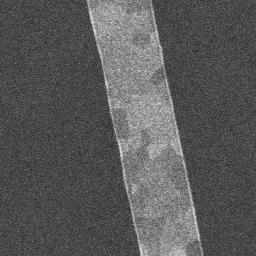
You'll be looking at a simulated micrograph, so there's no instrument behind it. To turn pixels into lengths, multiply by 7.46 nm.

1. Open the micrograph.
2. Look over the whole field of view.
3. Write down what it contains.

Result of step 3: one or a few lines or trenches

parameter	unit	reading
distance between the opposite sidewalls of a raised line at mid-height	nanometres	456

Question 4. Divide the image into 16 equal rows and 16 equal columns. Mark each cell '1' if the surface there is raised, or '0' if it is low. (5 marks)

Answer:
0000001111000000
0000001111000000
0000001111000000
0000001111000000
0000000111000000
0000000111100000
0000000111100000
0000000111100000
0000000111100000
0000000011100000
0000000011110000
0000000011110000
0000000011110000
0000000011110000
0000000001110000
0000000001111000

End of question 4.